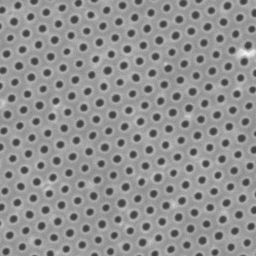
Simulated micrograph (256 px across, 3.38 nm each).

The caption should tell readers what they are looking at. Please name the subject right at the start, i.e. a regular array of holes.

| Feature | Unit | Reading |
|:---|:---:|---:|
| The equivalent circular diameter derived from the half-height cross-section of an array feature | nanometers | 24.4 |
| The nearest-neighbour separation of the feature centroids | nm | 55.5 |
